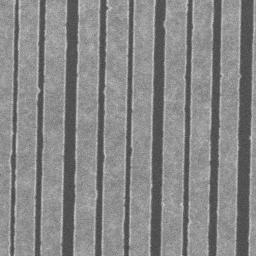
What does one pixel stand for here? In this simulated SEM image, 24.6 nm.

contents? parallel lines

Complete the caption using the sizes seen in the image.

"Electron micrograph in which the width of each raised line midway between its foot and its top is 494 nm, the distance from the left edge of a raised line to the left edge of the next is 709 nm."